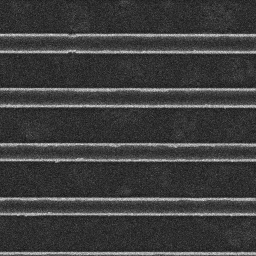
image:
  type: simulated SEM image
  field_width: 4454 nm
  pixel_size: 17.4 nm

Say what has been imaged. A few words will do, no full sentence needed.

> parallel lines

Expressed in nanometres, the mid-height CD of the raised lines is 295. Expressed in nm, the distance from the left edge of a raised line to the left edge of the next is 946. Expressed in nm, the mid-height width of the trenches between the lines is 655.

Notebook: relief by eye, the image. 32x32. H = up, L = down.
LLLLLLLLLLLLLLLLLLLLLLLLLLLLLLLL
LLLLLLLLLLLLLLLLLLLLLLLLLLLLLLLL
LLLLLLLLLLLLLLLLLLLLLLLLLLLLLLLL
LLLLLLLLLLLLLLLLLLLLLLLLLLLLLLLL
HHHHHHHHHHHHHHHHHHHHHHHHHHHHHHHH
HHHHHHHHHHHHHHHHHHHHHHHHHHHHHHHH
HHHHHHHHHHHHHHHHHHHHHHHHHHHHHHHH
LLLLLLLLLLLLLLLLLLLLLLLLLLLLLLLL
LLLLLLLLLLLLLLLLLLLLLLLLLLLLLLLL
LLLLLLLLLLLLLLLLLLLLLLLLLLLLLLLL
LLLLLLLLLLLLLLLLLLLLLLLLLLLLLLLL
HHHHHHHHHHHHHHHHHHHHHHHHHHHHHHHH
HHHHHHHHHHHHHHHHHHHHHHHHHHHHHHHH
LLLLLLLLLLLLLLLLLLLLLLLLLLLLLLLL
LLLLLLLLLLLLLLLLLLLLLLLLLLLLLLLL
LLLLLLLLLLLLLLLLLLLLLLLLLLLLLLLL
LLLLLLLLLLLLLLLLLLLLLLLLLLLLLLLL
LLLLLLLLLLLLLLLLLLLLLLLLLLLLLLLL
HHHHHHHHHHHHHHHHHHHHHHHHHHHHHHHH
HHHHHHHHHHHHHHHHHHHHHHHHHHHHHHHH
LLLLLLLLLLLLLLLLLLLLLLLLLLLLLLLL
LLLLLLLLLLLLLLLLLLLLLLLLLLLLLLLL
LLLLLLLLLLLLLLLLLLLLLLLLLLLLLLLL
LLLLLLLLLLLLLLLLLLLLLLLLLLLLLLLL
LLLLLLLLLLLLLLLLLLLLLLLLLLLLLLLL
HHHHHHHHHHHHHHHHHHHHHHHHHHHHHHHH
HHHHHHHHHHHHHHHHHHHHHHHHHHHHHHHH
LLLLLLLLLLLLLLLLLLLLLLLLLLLLLLLL
LLLLLLLLLLLLLLLLLLLLLLLLLLLLLLLL
LLLLLLLLLLLLLLLLLLLLLLLLLLLLLLLL
LLLLLLLLLLLLLLLLLLLLLLLLLLLLLLLL
LLLLLLLLLLLLLLLLLLLLLLLLLLLLLLLL